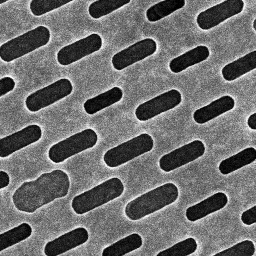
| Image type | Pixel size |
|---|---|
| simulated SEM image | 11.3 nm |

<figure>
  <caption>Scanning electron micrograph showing a regular array of holes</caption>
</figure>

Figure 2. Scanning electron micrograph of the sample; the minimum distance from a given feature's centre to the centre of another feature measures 0.615 um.